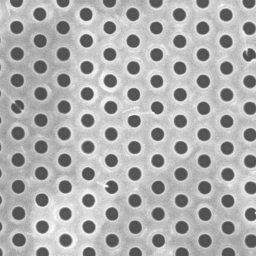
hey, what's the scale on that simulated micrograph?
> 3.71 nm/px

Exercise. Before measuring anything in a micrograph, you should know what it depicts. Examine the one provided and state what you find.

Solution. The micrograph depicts a regular array of holes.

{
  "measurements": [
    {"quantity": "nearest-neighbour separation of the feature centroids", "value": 98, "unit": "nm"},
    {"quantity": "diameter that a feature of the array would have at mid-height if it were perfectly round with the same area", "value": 49.7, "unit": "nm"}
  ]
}